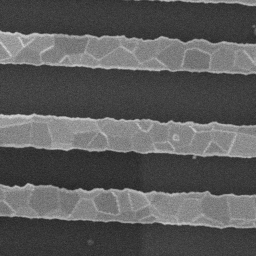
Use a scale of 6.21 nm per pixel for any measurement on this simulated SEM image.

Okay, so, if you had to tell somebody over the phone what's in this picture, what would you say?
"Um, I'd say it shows lines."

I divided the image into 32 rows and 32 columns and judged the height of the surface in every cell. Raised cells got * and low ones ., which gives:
..............................**
................................
................................
................................
************.*..................
******************************..
********************************
********************************
.............*******************
................................
................................
................................
................................
................................
*****...........................
*************************.**....
********************************
********************************
.....***************************
.............................***
................................
................................
................................
*******.........................
********************************
********************************
********************************
...........*********************
................................
................................
................................
................................